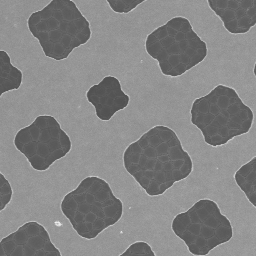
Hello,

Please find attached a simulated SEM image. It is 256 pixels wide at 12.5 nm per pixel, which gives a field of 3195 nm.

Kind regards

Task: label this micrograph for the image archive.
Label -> holes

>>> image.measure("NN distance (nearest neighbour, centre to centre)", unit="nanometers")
1010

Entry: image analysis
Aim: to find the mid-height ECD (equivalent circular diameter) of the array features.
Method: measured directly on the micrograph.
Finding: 55.7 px